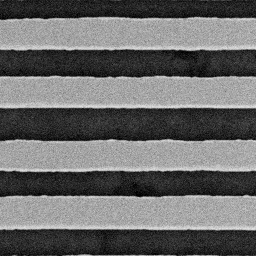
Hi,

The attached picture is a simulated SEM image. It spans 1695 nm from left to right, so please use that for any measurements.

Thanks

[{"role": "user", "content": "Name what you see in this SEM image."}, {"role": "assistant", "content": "lines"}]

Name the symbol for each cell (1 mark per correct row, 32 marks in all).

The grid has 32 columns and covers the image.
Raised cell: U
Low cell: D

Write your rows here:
DDDDDDDDDDDDDDDDDDDDDDDDDDDDDDDD
DDDDDDDDDDDDDDDDDDDDDDDDDDDDDDDD
DUUUUUUUUUUUUUUUUUUUUUUUUUUUUUUU
UUUUUUUUUUUUUUUUUUUUUUUUUUUUUUUU
UUUUUUUUUUUUUUUUUUUUUUUUUUUUUUUU
UUUUUUUUUUUUUUUUUUUUUUUUUUUUUUUU
DDDDDDDDDDDDDDDDDDDDDDDDDDDDDDDD
DDDDDDDDDDDDDDDDDDDDDDDDDDDDDDDD
DDDDDDDDDDDDDDDDDDDDDDDDDDDDDDDD
DDDDDDDDDDDDDDDDDDDDDDDDDDDDDDDD
UUUUUUUUUUUUUUUUUUUUUUUUUUUUUUUU
UUUUUUUUUUUUUUUUUUUUUUUUUUUUUUUU
UUUUUUUUUUUUUUUUUUUUUUUUUUUUUUUU
DDDDDDDDDDDDDDDDDDDDDDDDDDDDDDDD
DDDDDDDDDDDDDDDDDDDDDDDDDDDDDDDD
DDDDDDDDDDDDDDDDDDDDDDDDDDDDDDDD
DDDDDDDDDDDDDDDDDDDDDDDDDDDDDDDD
DDDDDDDDDDDDDDDDDDDDDDDDDDDDDDDD
UUUUUUUUUUUUUUUUUUUUUUUUUUUUUUUU
UUUUUUUUUUUUUUUUUUUUUUUUUUUUUUUU
UUUUUUUUUUUUUUUUUUUUUUUUUUUUUUUU
DDDDDDDDDDDDDDDDDDDDDDDDDDDDDDDD
DDDDDDDDDDDDDDDDDDDDDDDDDDDDDDDD
DDDDDDDDDDDDDDDDDDDDDDDDDDDDDDDD
DDDDDUDDDDDDDDDDDDDDDDDUUUUDDDUD
UUUUUUUUUUUUUUUUUUUUUUUUUUUUUUUU
UUUUUUUUUUUUUUUUUUUUUUUUUUUUUUUU
UUUUUUUUUUUUUUUUUUUUUUUUUUUUUUUU
UUDDDDDDDDDDDDUDDDUUUUUUUUUUUUUU
DDDDDDDDDDDDDDDDDDDDDDDDDDDDDDDD
DDDDDDDDDDDDDDDDDDDDDDDDDDDDDDDD
DDDDDDDDDDDDDDDDDDDDDDDDDDDDDDDD